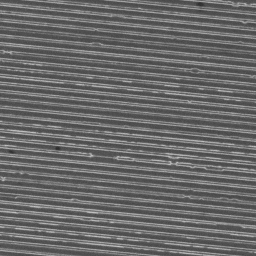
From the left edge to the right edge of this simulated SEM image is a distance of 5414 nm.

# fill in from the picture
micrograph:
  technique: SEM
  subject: parallel lines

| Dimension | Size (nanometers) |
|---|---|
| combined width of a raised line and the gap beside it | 166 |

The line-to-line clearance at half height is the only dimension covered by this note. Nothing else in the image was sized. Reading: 105 nanometers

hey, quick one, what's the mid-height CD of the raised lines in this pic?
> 60.5 nanometers